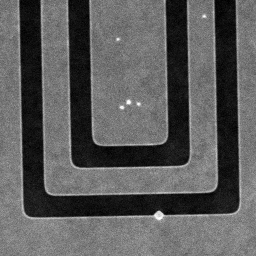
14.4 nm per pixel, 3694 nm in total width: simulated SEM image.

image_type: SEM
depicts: groups of lines, slits or small figures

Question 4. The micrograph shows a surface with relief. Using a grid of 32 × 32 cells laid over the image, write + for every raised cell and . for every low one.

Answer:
++...+++...++++++++++..++++..+++
++...+++...++++++++++..++++...++
++...+++...++++++++++..++++...++
++...++++..++++++++++..++++...++
++...++++..++++++++++..++++...++
++...++++..++++++++++..++++...++
++...++++..++++++++++...+++...++
++...++++..++++++++++...+++...++
+++..++++..++++++++++...+++...++
+++..++++..++++++++++...+++...++
+++..++++..++++++++++...+++...++
+++..++++..++++++++++...+++...++
+++..++++..++++++++++...+++...++
+++..++++..++++++++++...+++...++
+++..++++...+++++++++...+++...++
+++..++++...+++++++++...+++...++
+++..++++...+++++++++...+++...++
+++..++++...+++++++++...+++...++
+++...+++...............+++...++
+++...+++...............+++...++
+++...+++..............++++...++
+++...+++++++++++++++++++++...++
+++...+++++++++++++++++++++...++
+++...+++++++++++++++++++++...++
+++...........................++
+++...........................++
+++..........................+++
++++++++++++++++++++++++++++++++
++++++++++++++++++++++++++++++++
++++++++++++++++++++++++++++++++
++++++++++++++++++++++++++++++++
++++++++++++++++++++++++++++++++